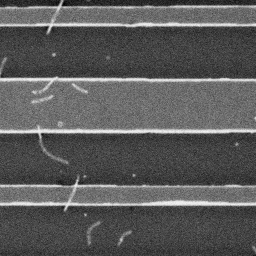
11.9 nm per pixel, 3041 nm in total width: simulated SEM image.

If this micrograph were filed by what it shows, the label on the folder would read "lines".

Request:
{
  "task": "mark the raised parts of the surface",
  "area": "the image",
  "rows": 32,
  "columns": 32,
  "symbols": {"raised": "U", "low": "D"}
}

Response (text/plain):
DDDDDDDDDDDDDDDDDDDDDDDDDDDDDDDD
UUUUUUUUUUUUUUUUUUUUUUUUUUUUUUUU
UUUUUUUUUUUUUUUUUUUUUUUUUUUUUUUU
DDDDDDDDDDDDDDDDDDDDDDDDDDDDDDDD
DDDDDDDDDDDDDDDDDDDDDDDDDDDDDDDD
DDDDDDDDDDDDDDDDDDDDDDDDDDDDDDDD
DDDDDDDDDDDDDDDDDDDDDDDDDDDDDDDD
DDDDDDDDDDDDDDDDDDDDDDDDDDDDDDDD
DDDDDDDDDDDDDDDDDDDDDDDDDDDDDDDD
DDDDDDDDDDDDDDDDDDDDDDDDDDDDDDDD
UUUUUUUUUUUUUUUUUUUUUUUUUUUUUUUU
UUUUUUUUUUUUUUUUUUUUUUUUUUUUUUUU
UUUUUUUUUUUUUUUUUUUUUUUUUUUUUUUU
UUUUUUUUUUUUUUUUUUUUUUUUUUUUUUUU
UUUUUUUUUUUUUUUUUUUUUUUUUUUUUUUU
UUUUUUUUUUUUUUUUUUUUUUUUUUUUUUUU
UUUUUDDUUDDUUUUUUDDDDDUUUUDDDDDD
DDDDDDDDDDDDDDDDDDDDDDDDDDDDDDDD
DDDDDDDDDDDDDDDDDDDDDDDDDDDDDDDD
DDDDDDDDDDDDDDDDDDDDDDDDDDDDDDDD
DDDDDDDDDDDDDDDDDDDDDDDDDDDDDDDD
DDDDDDDDDDDDDDDDDDDDDDDDDDDDDDDD
DDDDDDDDDDDDDDDDDDDDDDDDDDDDDDDD
UUUUUUUUUUUUUUUUUUUUUUUUUUUUUUUU
UUUUUUUUUUUUUUUUUUUUUUUUUUUUUUUU
UUUUUUUUUUUUUUUUUUUUUDDDDUUUUUUU
DDDDDDDDDDDDDDDDDDDDDDDDDDDDDDDD
DDDDDDDDDDDDDDDDDDDDDDDDDDDDDDDD
DDDDDDDDDDDDDDDDDDDDDDDDDDDDDDDD
DDDDDDDDDDDDDDDDDDDDDDDDDDDDDDDD
DDDDDDDDDDDDDDDDDDDDDDDDDDDDDDDD
DDDDDDDDDDDDDDDDDDDDDDDDDDDDDDDD